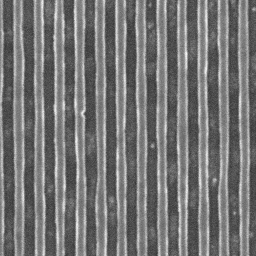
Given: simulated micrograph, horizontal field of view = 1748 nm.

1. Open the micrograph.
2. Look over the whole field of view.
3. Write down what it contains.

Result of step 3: parallel lines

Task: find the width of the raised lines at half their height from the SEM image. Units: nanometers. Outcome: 58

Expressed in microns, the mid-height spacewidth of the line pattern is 0.0828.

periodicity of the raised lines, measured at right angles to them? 20.5 pixels